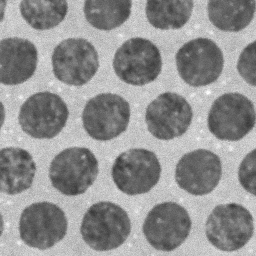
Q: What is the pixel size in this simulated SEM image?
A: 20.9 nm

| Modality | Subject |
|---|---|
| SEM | a regular array of holes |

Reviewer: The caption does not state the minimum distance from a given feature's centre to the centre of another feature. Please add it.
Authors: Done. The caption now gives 1.31 µm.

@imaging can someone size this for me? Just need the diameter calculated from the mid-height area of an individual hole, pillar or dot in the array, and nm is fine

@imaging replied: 1040